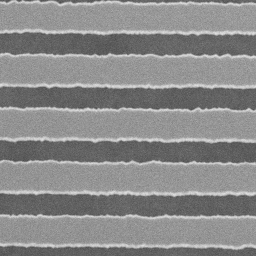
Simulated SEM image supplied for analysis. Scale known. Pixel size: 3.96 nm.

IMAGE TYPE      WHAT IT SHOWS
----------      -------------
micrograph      lines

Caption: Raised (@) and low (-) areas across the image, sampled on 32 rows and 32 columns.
@@@@@@@@@@@@@@@@@@@@@@@@@@@@@@@@
@@@@@@@@@@@@@@@@@@@@@@@@@@@@@@@@
@@@@@@@@@@@@@@@@@@@@@@@@@@@@@@@@
@@@@@@@@@@@@@@@@@@@@@@@@@@@@@@@@
--------------------------------
--------------------------------
--------------------------------
@@@@@@@@@@@@@@@@@@@@@@@@@@@@@@@@
@@@@@@@@@@@@@@@@@@@@@@@@@@@@@@@@
@@@@@@@@@@@@@@@@@@@@@@@@@@@@@@@@
@@@@@@@@@@@@@@@@@@@@@@@@@@@@@@@@
--------------------------------
--------------------------------
@@-@@@@-------------------------
@@@@@@@@@@@@@@@@@@@@@@@@@@@@@@@@
@@@@@@@@@@@@@@@@@@@@@@@@@@@@@@@@
@@@@@@@@@@@@@@@@@@@@@@@@@@@@@@@@
@@@@@@@@@@@@@@@@@@@@@@@@@@@@@@@@
--------------------------------
--------------------------------
@@@@@@@@@@@@@@@@@@@@@@@@@@@@@@@@
@@@@@@@@@@@@@@@@@@@@@@@@@@@@@@@@
@@@@@@@@@@@@@@@@@@@@@@@@@@@@@@@@
@@@@@@@@@@@@@@@@@@@@@@@@@@@@@@@@
--------------------------------
--------------------------------
--------------------------------
@@@@@@@@@@@@@@@@@@@@@@@@@@@@@@@@
@@@@@@@@@@@@@@@@@@@@@@@@@@@@@@@@
@@@@@@@@@@@@@@@@@@@@@@@@@@@@@@@@
@@@@@@@@@@@@@@@@@@@@@@@@@@@@@@@@
--------------------------------